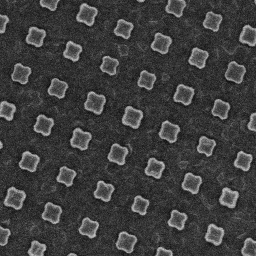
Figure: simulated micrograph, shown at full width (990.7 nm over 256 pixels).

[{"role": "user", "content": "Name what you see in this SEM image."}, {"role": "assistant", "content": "a regular array of raised bodies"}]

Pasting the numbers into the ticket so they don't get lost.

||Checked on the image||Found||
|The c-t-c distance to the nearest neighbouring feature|153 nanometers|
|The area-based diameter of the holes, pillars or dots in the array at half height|18.3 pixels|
